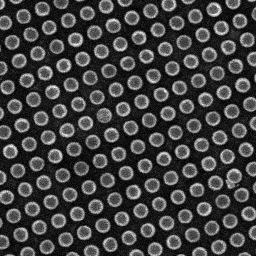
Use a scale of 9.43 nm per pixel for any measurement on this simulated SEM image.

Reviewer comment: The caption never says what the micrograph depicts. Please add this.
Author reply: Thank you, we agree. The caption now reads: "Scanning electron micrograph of a regular array of raised bodies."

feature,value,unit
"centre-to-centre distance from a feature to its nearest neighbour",0.188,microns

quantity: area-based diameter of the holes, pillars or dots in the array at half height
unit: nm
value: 129